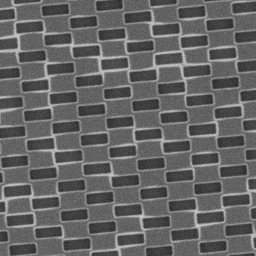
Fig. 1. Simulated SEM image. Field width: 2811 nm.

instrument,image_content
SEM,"groups of lines, slits or small figures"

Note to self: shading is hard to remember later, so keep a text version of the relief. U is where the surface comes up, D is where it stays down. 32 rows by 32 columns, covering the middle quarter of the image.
DDDUUUUUUDDDDDDDUUUUUUUDDDUUUUDD
DDDUUUUUUDDDDDUUUUUUDDDUUUUUUDDD
UUUUUUUDDDUUUUUUDDDDDDDUUUUUUUDD
UUUDDDDDDDUUUUUUDDDDDDDUUUUUUUDD
UUUDDDDDDDUUUUUUUDDUUUUUUUUUDDUU
UUUDDDDUUUUUUUUDUUUUUUUDDDDDDDUU
UUUUUUUUUUDDDDDDDUUUUUUDDDDDDDUU
DDDUUUUUUUDDDDDDDUUUUUUUDDDDUUUU
DDDUUUUUUUDDDDDUUUUUUUUUUUUUUUDD
DDDUUUUUUUUUUUUUUDDDDDDDUUUUUUDD
UUUUDDDDDDUUUUUUUDDDDDDDUUUUUUUD
UUUDDDDDDDDUUUUUUDDDDDUUUUUUUUUU
UUUUDDDDDDUUUUUUUUUUUUUUDDDDDDDU
UUUUUUUUUUUDDDDDDUUUUUUUDDDDDDDU
DDDDUUUUUUDDDDDDDDUUUUUUDDDDDDDU
DDDDUUUUUUDDDDDDDUUUUUUUUUUUUUUD
DDDDUUUUUUUUUUUUUUDDDDDDUUUUUUUD
UUUUUUDDDDDUUUUUUDDDDDDDUUUUUUUD
UUUUDDDDDDDUUUUUUUDDDDDDDUUUUUUU
UUUUDDDDDDDUUUUUUUUUUUUUUDDDDDDD
UUUUUDDDUUUUUDDDDDUUUUUUDDDDDDDD
UUUUUUUUUUUDDDDDDDUUUUUUUDDDDDDD
DDDDDUUUUUUDDDDDDDUUUUUUUUUUUUUU
DDDDDUUUUUUUDDDUUUUUUDDDDUUUUUUU
DDDUUUUUUUUUUUUUUUDDDDDDDUUUUUUU
UUUUUDDDDDDDUUUUUUDDDDDDDUUUUUUU
UUUUUDDDDDDDUUUUUUUDDDUUUUUUDDDD
UUUUUDDDDDDDUUUUUUUUUUUUUDDDDDDD
UUUUUUUUUUUUDDDDDDDUUUUUUDDDDDDD
DDDDDUUUUUUUDDDDDDDUUUUUUUDDDUUU
DDDDDUUUUUUUDDDDDDUUUUUUUUUUUUUU
DDDDDUUUUUUUUUUUUUUDDDDDDDUUUUUU